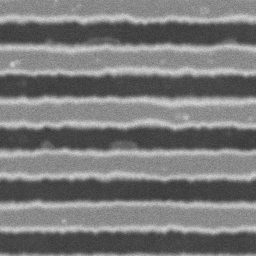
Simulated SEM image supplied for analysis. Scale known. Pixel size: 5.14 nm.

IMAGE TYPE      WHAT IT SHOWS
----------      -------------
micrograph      lines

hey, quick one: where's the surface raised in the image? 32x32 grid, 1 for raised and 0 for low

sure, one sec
11111111111111111111111111111111
11111111111111111111111111111111
11111111111111111111111111111111
00000000000000000000000000000000
00000000000000000000000000000000
00000000000000000000000000001000
11111111111111111111111111111111
11111111111111111111111111111111
11111111111111111111111111111111
00000000000010000000010010000000
00000000000000000000000000000000
00000000000000000000000000000000
11111111111111111111111111111111
11111111111111111111111111111111
11111111111111111111111111111111
11111111111111111111111111111111
00000000000000000000000000000000
00000000000000000000000000000000
00000000000000000000000000000000
11111111111111111111111111111111
11111111111111111111111111111111
11111111111111111111111111111111
01011000000011000001110111100111
00000000000000000000000000000000
00000000000000000000000000000000
11111111111111111111111111111111
11111111111111111111111111111111
11111111111111111111111111111111
11111111111111111111111111111111
00000000000000000000000000000000
00000000000000000000000000000000
00000000000000000000000000000000